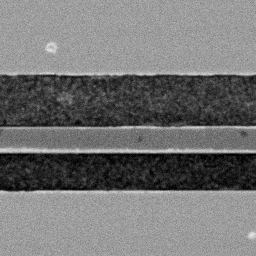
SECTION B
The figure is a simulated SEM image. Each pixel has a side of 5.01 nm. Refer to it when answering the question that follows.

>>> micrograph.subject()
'lines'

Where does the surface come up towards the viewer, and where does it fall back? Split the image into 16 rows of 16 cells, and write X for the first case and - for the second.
XXXXXXXXXXXXXXXX
XXXXXXXXXXXXXXXX
XXXXXXXXXXXXXXXX
XXXXXXXXXXXXXXXX
XXXXXXXXXXXXXXXX
----------------
----------------
----------------
XXXXXXXXXXXXXXXX
X-XXXXX-XXXXXXXX
----------------
----------------
XXXXXXXXXXXXXXXX
XXXXXXXXXXXXXXXX
XXXXXXXXXXXXXXXX
XXXXXXXXXXXXXXXX